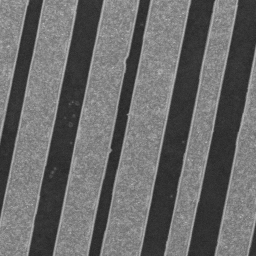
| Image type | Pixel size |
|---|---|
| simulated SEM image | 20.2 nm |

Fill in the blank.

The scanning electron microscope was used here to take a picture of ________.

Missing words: parallel lines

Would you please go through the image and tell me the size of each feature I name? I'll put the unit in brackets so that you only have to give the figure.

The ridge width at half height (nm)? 661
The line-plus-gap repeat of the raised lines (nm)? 1090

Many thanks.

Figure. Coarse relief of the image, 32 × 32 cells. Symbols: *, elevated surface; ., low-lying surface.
***..*****...****..*****...***..
***..****....****..****....**...
***..****....****.*****....**...
***..****...*****.*****...***...
**...****...****..*****...***...
**...****...****..*****...***...
**..****....****..****....**....
**..****....****..****....**....
**..****...*****.*****...***....
*...****...****..*****...***...*
*...****...****..*****...***...*
*..****....****..****....**....*
*..****....****..****....**....*
*..****...*****.*****...***....*
...****...****..*****...***...**
...****...****..*****...***...**
..****....****..****....***...**
..****....****..****....**....**
..****...*****.*****...***....**
..****...****..*****...***...***
..****...****..*****...***...***
.****....****..****....**....***
.****....****..****....**....***
.****...*****.*****...***....***
.****...****..*****...***...****
.****...****..*****...***...****
****....****..****....**....****
****....****..****....**....****
****...*****.*****...***....****
****...****..*****...***...****.
****...****..*****...***...****.
***....****..****....**....****.